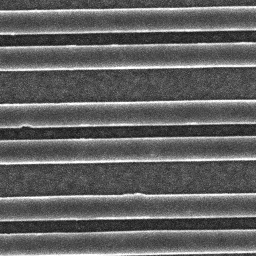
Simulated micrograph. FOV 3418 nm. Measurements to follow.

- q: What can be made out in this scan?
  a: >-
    parallel lines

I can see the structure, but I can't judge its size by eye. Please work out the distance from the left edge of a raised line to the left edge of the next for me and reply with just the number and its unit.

0.607 microns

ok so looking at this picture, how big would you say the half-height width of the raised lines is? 305 nanometers